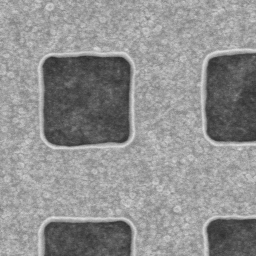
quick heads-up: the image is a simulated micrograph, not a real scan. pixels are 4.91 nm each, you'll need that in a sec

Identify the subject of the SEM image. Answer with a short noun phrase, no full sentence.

holes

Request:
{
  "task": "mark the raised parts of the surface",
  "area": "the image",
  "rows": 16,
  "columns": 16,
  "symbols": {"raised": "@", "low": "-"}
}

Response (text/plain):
@@@@@@@@@@@@@@@@
@@@@@@@@@@@@@@@@
@@@@@@@@@@@@@@@@
@@@-----@@@@@---
@@@-----@@@@@---
@@@-----@@@@@---
@@@-----@@@@@---
@@@-----@@@@@---
@@@-----@@@@@---
@@@@@@@@@@@@@@@@
@@@@@@@@@@@@@@@@
@@@@@@@@@@@@@@@@
@@@@@@@@@@@@@@@@
@@@@@@@@@@@@@@@@
@@@-----@@@@@---
@@@-----@@@@@---